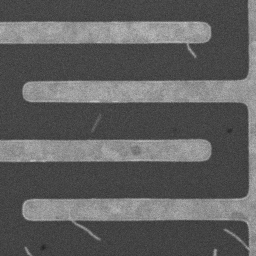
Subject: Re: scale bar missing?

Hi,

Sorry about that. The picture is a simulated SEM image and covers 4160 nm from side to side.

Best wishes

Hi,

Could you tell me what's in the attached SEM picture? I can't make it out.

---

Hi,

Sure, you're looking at groups of lines, slits or small figures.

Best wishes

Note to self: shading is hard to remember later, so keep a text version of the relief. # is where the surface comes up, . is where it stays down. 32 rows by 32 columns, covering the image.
...............................#
...............................#
...............................#
##########################.....#
##########################.....#
...............................#
...............................#
...............................#
...............................#
...............................#
...#############################
...#############################
...#############################
...............................#
...............................#
...............................#
...............................#
...............................#
##########################.....#
##########################.....#
...............................#
...............................#
...............................#
...............................#
...............................#
...#############################
...#############################
....##..##.#######............##
...............................#
...............................#
...............................#
...............................#